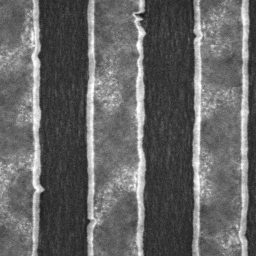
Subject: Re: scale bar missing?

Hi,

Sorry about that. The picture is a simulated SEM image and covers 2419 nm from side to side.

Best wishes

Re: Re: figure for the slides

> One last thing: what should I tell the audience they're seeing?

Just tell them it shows one or a few lines or trenches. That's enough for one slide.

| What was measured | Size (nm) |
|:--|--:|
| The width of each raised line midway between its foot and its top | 464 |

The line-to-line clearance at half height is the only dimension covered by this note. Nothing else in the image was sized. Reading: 516 nm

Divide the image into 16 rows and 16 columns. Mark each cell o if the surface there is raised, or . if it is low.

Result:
oo....ooo...ooo.
oo....ooo...ooo.
oo....ooo...ooo.
oo....ooo...ooo.
oo....ooo...ooo.
oo....ooo...ooo.
oo....ooo...ooo.
oo....ooo...ooo.
oo....ooo...ooo.
oo....ooo...ooo.
oo....ooo...ooo.
oo....ooo...ooo.
oo....ooo...ooo.
oo....ooo...ooo.
oo....ooo...ooo.
oo....ooo...ooo.